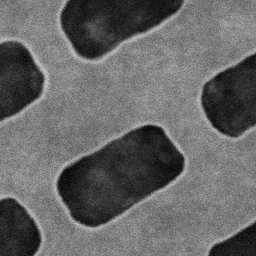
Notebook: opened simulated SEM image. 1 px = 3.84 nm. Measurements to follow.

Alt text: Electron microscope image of holes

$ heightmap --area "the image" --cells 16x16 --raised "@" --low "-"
@@@@-------@@@@@
@@@@------@@@@@@
@@@@----@@@@@@@@
--@@@-@@@@@@@@@@
---@@@@@@@@@@@--
---@@@@@@@@@@---
--@@@@@@@@@@@---
@@@@@@@@@@@@@---
@@@@@@@@--@@@@-@
@@@@@@-----@@@@@
@@@@-------@@@@@
@@@@-------@@@@@
-@@@-----@@@@@@@
--@@@--@@@@@@@@@
--@@@@@@@@@@@@@-
--@@@@@@@@@@@---